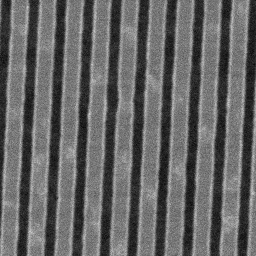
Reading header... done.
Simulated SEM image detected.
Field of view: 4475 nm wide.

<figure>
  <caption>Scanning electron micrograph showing parallel lines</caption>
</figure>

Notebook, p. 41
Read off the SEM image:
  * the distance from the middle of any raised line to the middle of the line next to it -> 481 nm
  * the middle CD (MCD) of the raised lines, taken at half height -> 286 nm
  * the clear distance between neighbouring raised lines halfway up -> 196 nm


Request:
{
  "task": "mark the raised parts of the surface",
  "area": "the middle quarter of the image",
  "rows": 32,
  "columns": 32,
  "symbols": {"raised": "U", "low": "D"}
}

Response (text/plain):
UUUUDDDUUUUDDDUUUUDDDUUUUDDDUUUU
UUUUDDDUUUUDDDUUUUDDDUUUUDDDUUUD
UUUUDDDUUUUDDDUUUUDDDUUUDDDUUUUD
UUUUDDDUUUUDDDUUUUDDDUUUDDDUUUUD
UUUUDDDUUUUDDDUUUUDDDUUUDDDUUUUD
UUUUDDDUUUUDDDUUUDDDDUUUDDDDUUUD
UUUUDDDUUUUDDDUUUUDDUUUUDDDDUUUD
UUUUDDDUUUDDDDUUUDDDUUUUDDDUUUUD
UUUUDDDUUUDDDDUUUDDDUUUUDDDUUUUD
UUUDDDDUUUDDDDUUUDDDUUUUDDDUUUUD
UUUDDDUUUUUDDDUUUDDDUUUUDDDUUUUD
UUUDDDUUUUUDDDUUUDDDUUUUDDDUUUUD
UUUDDDUUUUDDDUUUUDDDUUUUDDDUUUUD
UUUDDDUUUUDDDUUUUDDDUUUUDDDUUUUD
UUUDDDUUUUDDDUUUUDDDUUUUDDDUUUUD
UUUDDDUUUUDDDUUUUDDDUUUUDDDUUUUD
UUUDDDUUUUDDDUUUUDDDUUUUDDDUUUUD
UUUDDDUUUUDDDUUUUDDDUUUUDDDUUUUD
UUUDDDUUUUDDDUUUUDDDUUUUDDDUUUUD
UUUDDDUUUUDDDUUUUDDDUUUUDDDUUUUD
UUUDDDUUUUDDDUUUUDDDUUUUDDDUUUUD
UUUDDDUUUUDDDUUUUDDDUUUUDDDUUUDD
UUUDDDUUUUDDDUUUUDDDUUUUDDDUUUDD
UUUDDDUUUUDDDUUUUDDDUUUDDDDUUUDD
UUUDDDUUUUDDDUUUUDDDUUUUDDDUUUDD
UUUDDDUUUUDDDUUUUDDDUUUUDDDUUUDD
UUUDDDUUUUDDDUUUUDDUUUUUDDUUUUDD
UUUDDDUUUUDDDUUUUDDUUUUDDDUUUUDD
UUUDDDUUUDDDDUUUDDDUUUUDDDUUUUDD
UUUDDDUUUDDDDUUUUDDUUUUDDDUUUUDD
UUUDDDUUUDDDDUUUDDDUUUUDDDUUUUDD
UUDDDUUUUDDDDUUUDDDUUUUDDDUUUUDD